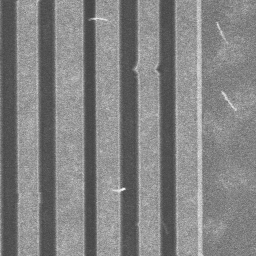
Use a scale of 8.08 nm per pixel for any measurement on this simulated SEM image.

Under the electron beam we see parallel lines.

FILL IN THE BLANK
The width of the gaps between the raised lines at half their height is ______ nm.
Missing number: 120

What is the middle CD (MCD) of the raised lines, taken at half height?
0.204 µm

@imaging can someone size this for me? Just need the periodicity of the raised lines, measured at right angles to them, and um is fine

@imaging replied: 0.322